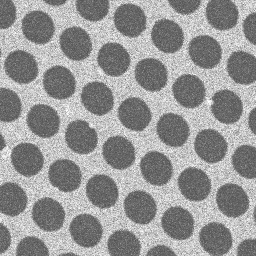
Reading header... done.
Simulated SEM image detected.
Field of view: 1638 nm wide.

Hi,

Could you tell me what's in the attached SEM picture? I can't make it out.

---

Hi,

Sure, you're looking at a regular array of holes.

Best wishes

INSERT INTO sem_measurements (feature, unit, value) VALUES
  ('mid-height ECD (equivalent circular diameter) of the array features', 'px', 33.3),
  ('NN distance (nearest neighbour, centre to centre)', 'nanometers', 262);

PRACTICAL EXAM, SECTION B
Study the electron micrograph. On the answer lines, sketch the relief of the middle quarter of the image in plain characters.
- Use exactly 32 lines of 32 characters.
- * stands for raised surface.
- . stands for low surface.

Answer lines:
*********.......**.......*******
.*********......**........******
..********.....***........******
...***************........**....
...****..*********........**....
...**......********......**.....
...**.......*********...***.....
..**........***************.....
.***........****...*********....
****........***.....*********...
*****.......**.......*********..
******......*.........**********
*******....**.........***...****
**************........**......**
**....********........*........*
*......********......**........*
........*********...***........*
........***************........*
........***....*********.......*
*.......**.......********......*
*.......**.......*********...***
**.....***........**************
****..****........***....*******
**********........**......******
...********......**........*****
....*******......**........*****
....***************........***..
....***************........**...
....***.....********.......**...
....**.......********.....**....
....*........****************...
...**........*****.**********...